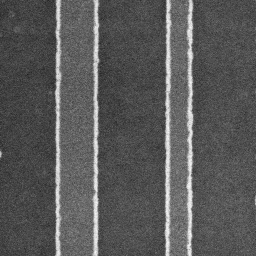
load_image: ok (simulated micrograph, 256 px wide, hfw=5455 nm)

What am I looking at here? one or a few lines or trenches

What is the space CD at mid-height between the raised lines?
1530 nanometres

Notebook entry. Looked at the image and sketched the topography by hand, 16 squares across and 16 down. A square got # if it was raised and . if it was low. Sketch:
....##....##....
....##....##....
....##....##....
....##....##....
....##....##....
....##....##....
....##....##....
....##....##....
....##....##....
....##....##....
....##....##....
....##....##....
....##....##....
....##....##....
....##....##....
....##....##....